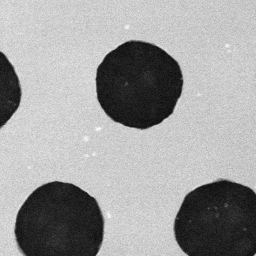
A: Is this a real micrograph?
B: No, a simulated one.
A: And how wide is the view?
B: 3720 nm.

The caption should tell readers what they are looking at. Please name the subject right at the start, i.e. holes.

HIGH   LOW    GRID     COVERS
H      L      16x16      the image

HHHHHHHHHHHHHHHH
HHHHHHHHHHHHHHHH
HHHHHHHHHHHHHHHH
HHHHHHHLLLLHHHHH
LHHHHHLLLLLHHHHH
LHHHHHLLLLLHHHHH
LHHHHHLLLLLHHHHH
LHHHHHHLLLHHHHHH
HHHHHHHHHHHHHHHH
HHHHHHHHHHHHHHHH
HHHHHHHHHHHHHHHH
HHHLHHHHHHHHHLLH
HHLLLLHHHHHLLLLL
HLLLLLHHHHHLLLLL
HLLLLLHHHHHLLLLL
HLLLLLHHHHHLLLLL